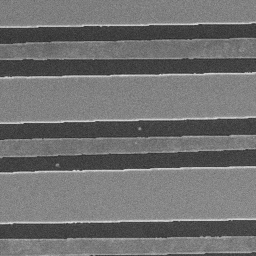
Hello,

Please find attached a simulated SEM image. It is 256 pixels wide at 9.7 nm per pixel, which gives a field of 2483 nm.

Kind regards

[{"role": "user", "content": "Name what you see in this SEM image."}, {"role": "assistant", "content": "lines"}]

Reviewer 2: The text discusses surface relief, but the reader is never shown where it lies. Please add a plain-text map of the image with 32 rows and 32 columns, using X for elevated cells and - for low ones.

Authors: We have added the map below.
XXXXXXXXXXXXXXXXXXXXXXXXXXXXXXXX
XXXXXXXXXXXXXXXXXXXXXXXXXXXXXXXX
XXXXXXXXXXXXXXXXXXXXXXXXXXXXXXXX
--------------------------------
--------------------------------
--XXXXXXXXXXXXXXXXXXXXXXXXXXXXXX
XXXXXXXXXXXXXXXXXXXXXXXXXXXXXXXX
--------------------------------
--------------------------------
-------------XXXXXXXXXXXXXXXXXXX
XXXXXXXXXXXXXXXXXXXXXXXXXXXXXXXX
XXXXXXXXXXXXXXXXXXXXXXXXXXXXXXXX
XXXXXXXXXXXXXXXXXXXXXXXXXXXXXXXX
XXXXXXXXXXXXXXXXXXXXXXXXXXXXXXXX
XXXXXXXXXXXXXXXXXXXXXXXXXXXXXXXX
--------------------------------
--------------------------------
XXXXXXXXXXXXXXXXXXXXXXXXXXXXXXXX
XXXXXXXXXXXXXXXXXXXXXXXXXXXXXXXX
XXXX----------------------------
--------------------------------
----XXXXXXXXXXXXXXXXXXXXXXXXXXXX
XXXXXXXXXXXXXXXXXXXXXXXXXXXXXXXX
XXXXXXXXXXXXXXXXXXXXXXXXXXXXXXXX
XXXXXXXXXXXXXXXXXXXXXXXXXXXXXXXX
XXXXXXXXXXXXXXXXXXXXXXXXXXXXXXXX
XXXXXXXXXXXXXXXXXXXXXXXXXXXXXXXX
XXXXXXXXXXXXXXXXXXXXXXXXXXXXX---
--------------------------------
--------------------------------
XXXXXXXXXXXXXXXXXXXXXXXXXXXXXXXX
XXXXXXXXXXXXXXXXXXXXXXXXXXXXXXX-